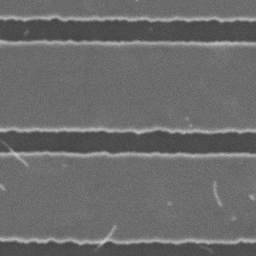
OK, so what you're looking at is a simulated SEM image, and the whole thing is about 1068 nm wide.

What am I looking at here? lines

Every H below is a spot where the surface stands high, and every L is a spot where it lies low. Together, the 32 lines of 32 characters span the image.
HHHHHHHHHHHHHHHHHHHHHHHHHHHHHHHH
HHHHHHHHHHHHHHHHHHHHHHHHHHHHHHHH
LLLHLLLLHLHHHLLLHHHHHHLHHHLHHHHH
LLLLLLLLLLLLLLLLLLLLLLLLLLLLLLLL
LLLLLLLLLLLLLLLLLLLLLLLLLLLLLLLL
HHHHHHHHHHHHHHHHHHHHHHHHHHHHHHHH
HHHHHHHHHHHHHHHHHHHHHHHHHHHHHHHH
HHHHHHHHHHHHHHHHHHHHHHHHHHHHHHHH
HHHHHHHHHHHHHHHHHHHHHHHHHHHHHHHH
HHHHHHHHHHHHHHHHHHHHHHHHHHHHHHHH
HHHHHHHHHHHHHHHHHHHHHHHHHHHHHHHH
HHHHHHHHHHHHHHHHHHHHHHHHHHHHHHHH
HHHHHHHHHHHHHHHHHHHHHHHHHHHHHHHH
HHHHHHHHHHHHHHHHHHHHHHHHHHHHHHHH
HHHHHHHHHHHHHHHHHHHHHHHHHHHHHHHH
HHHHHHHHHHHHHHHHHHHHHHHHHHHHHHHH
LLLLLLLLLLLLLHHHHHHLLHHHHHHHHHHH
LLLLLLLLLLLLLLLLLLLLLLLLLLLLLLLL
LLLLLLLLLLLLLLLLLLLLLLLLLLLLLLLL
HHHHHHHHHHHHHHHHHHHHHHHHHHHHHHHH
HHHHHHHHHHHHHHHHHHHHHHHHHHHHHHHH
HHHHHHHHHHHHHHHHHHHHHHHHHHHHHHHH
HHHHHHHHHHHHHHHHHHHHHHHHHHHHHHHH
HHHHHHHHHHHHHHHHHHHHHHHHHHHHHHHH
HHHHHHHHHHHHHHHHHHHHHHHHHHHHHHHH
HHHHHHHHHHHHHHHHHHHHHHHHHHHHHHHH
HHHHHHHHHHHHHHHHHHHHHHHHHHHHHHHH
HHHHHHHHHHHHHHHHHHHHHHHHHHHHHHHH
HHHHHHHHHHHHHHHHHHHHHHHHHHHHHHHH
HHHHHHHHHHHHHHHHHHHHHHHHHHHHHHHH
LLLLLLLLLLLLHLLLLLLLLLLLLLLLLLLL
LLLLLLLLLLLLLLLLLLLLLLLLLLLLLLLL